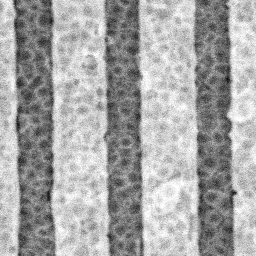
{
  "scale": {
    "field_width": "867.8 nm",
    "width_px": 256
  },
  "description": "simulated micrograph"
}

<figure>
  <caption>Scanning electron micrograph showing one or a few lines or trenches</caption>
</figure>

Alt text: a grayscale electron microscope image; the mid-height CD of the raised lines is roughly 175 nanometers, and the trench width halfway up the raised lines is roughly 128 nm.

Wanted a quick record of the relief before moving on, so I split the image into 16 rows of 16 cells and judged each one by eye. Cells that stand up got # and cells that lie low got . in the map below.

#..###...###..##
#..###...###..##
#..###...###..##
#..###...###..##
#..####..###..##
#..####..###...#
#..####..###...#
#..####..###..##
#..###...###...#
#..####..###...#
#..####..###...#
#..####..###...#
#..####..###...#
#..####..###...#
#...###..###...#
#...###..###...#